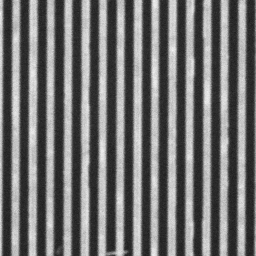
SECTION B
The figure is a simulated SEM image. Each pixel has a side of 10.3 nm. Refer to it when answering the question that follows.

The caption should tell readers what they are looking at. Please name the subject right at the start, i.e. parallel lines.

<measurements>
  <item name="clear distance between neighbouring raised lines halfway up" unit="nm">115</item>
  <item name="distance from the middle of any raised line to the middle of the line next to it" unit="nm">178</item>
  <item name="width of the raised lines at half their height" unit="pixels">5.62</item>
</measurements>